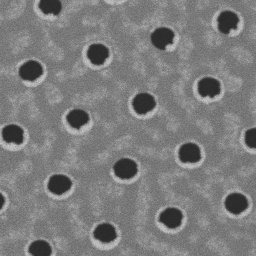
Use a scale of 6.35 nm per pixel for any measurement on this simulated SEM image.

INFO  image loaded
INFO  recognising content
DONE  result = a regular array of holes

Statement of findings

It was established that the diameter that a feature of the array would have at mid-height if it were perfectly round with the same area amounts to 138 nanometres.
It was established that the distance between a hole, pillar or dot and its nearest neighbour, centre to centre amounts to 423 nm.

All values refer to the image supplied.